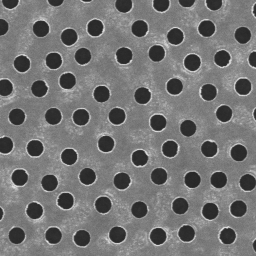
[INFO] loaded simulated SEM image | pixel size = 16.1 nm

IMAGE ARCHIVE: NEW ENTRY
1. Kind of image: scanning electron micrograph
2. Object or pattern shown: a regular array of holes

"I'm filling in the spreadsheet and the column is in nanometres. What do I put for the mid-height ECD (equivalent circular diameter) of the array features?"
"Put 270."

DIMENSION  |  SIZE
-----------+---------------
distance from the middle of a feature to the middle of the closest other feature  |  462 nm